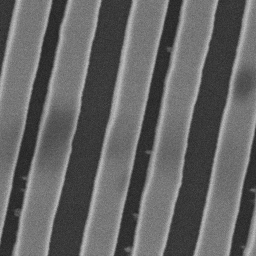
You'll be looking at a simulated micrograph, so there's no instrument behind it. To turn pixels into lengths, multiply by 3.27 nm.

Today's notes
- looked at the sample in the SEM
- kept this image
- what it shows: lines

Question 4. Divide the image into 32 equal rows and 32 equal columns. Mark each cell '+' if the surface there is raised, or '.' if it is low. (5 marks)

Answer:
..++++..+++++....++++..++++....+
..++++..++++....+++++..++++....+
..++++..++++....+++++..++++...++
.+++++..++++....++++..+++++...++
.++++..+++++....++++..++++....++
.++++..++++.....++++..++++....++
.++++..++++....+++++..++++....++
+++++..++++....++++..+++++...+++
+++++..++++....++++..++++....+++
++++..+++++....++++..++++....+++
++++..+++++....++++..++++....+++
++++..++++....+++++..++++....+++
++++..++++....++++..+++++...++++
++++..++++....++++..++++....++++
+++..+++++....++++..++++....++++
+++..+++++....++++..++++....++++
+++..++++....+++++..++++...+++++
+++..++++....++++..++++....+++++
++..+++++....++++..++++....++++.
++..+++++....++++..++++....++++.
++..+++++...+++++..++++....++++.
++..++++....++++...++++....++++.
++..++++....++++..+++++...+++++.
+..+++++....++++..++++....++++..
+..+++++....++++..++++....++++..
+..++++....+++++..++++....++++..
+..++++....++++..+++++....++++..
+.+++++....++++..++++....+++++..
..+++++....++++..++++....++++...
..++++....+++++..++++....++++..+
..++++....+++++..++++....++++..+
..++++....++++...+++....+++++..+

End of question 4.